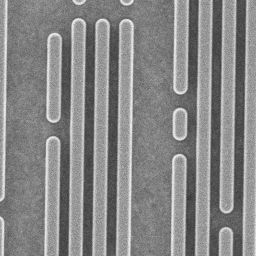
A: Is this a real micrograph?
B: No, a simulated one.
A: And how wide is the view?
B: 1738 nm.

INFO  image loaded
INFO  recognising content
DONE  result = groups of lines, slits or small figures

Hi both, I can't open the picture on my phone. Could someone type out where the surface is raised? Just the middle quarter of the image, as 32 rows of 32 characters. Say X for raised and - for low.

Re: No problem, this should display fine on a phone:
--XXX---XXX---XXX-----------XXX-
--XXX---XXX---XXX-----------XXX-
--XXX---XXX---XXX-----------XXX-
--XXX---XXX---XXX-----------XXX-
--XXX---XXX---XXX-----------XXX-
--XXX---XXX---XXX-----------XXX-
--XXX---XXX---XXX-----------XXX-
--XXX---XXX---XXX---------------
--XXX---XXX---XXX---------------
--XXX---XXX---XXX---------------
--XXX---XXX---XXX---------------
--XXX---XXX---XXX-----------XX--
--XXX---XXX---XXX-----------XXX-
--XXX---XXX---XXX----------XXXX-
--XXX---XXX---XXX----------XXXX-
--XXX---XXX---XXX----------XXXX-
--XXX---XXX---XXX----------XXXX-
--XXX---XXX---XXX----------XXXX-
--XXX---XXX---XXX-----------XX--
--XXX---XXX---XXX---------------
--XXX---XXX---XXX---------------
--XXX---XXX---XXX---------------
--XXX---XXX---XXX---------------
--XXX--XXXX---XXX----------XXX--
--XXX--XXXX---XXX----------XXXX-
--XXX--XXXX---XXX----------XXXX-
--XXX--XXXX---XXX----------XXX--
--XXX--XXXX---XXX----------XXX--
--XXX--XXXX---XXX----------XXX--
--XXX--XXXX---XXX----------XXX--
--XXX--XXXX--XXXX----------XXX--
-XXXX--XXXX--XXXX----------XXX--